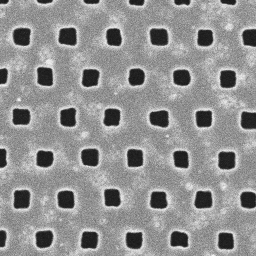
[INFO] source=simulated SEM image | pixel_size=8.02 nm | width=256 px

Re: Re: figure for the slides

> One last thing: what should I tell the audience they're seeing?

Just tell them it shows a regular array of holes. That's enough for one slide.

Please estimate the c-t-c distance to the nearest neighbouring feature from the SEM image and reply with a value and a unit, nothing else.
360 nm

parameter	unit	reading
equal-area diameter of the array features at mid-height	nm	142